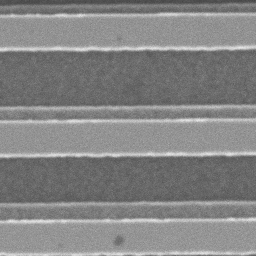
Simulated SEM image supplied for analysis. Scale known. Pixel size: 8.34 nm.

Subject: lines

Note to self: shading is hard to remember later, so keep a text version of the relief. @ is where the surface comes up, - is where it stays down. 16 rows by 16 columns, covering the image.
----------------
@@@@@@@@@@@@@@@@
@@@@@@@@@@@@@@@@
----------------
----------------
----------------
----------------
----------@@@@@@
@@@@@@@@@@@@@@@@
@@@@@@@@@@@@@@@@
----------------
----------------
----------------
----------------
@@@@@@@@@@@@@@@@
@@@@@@@@@@@@@@@@